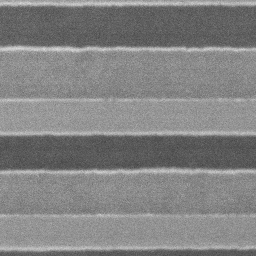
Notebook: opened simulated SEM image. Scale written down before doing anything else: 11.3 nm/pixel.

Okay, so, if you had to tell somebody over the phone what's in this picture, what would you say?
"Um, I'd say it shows lines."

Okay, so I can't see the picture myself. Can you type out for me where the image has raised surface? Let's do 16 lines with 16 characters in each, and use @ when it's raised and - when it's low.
----------------
----------------
----------------
@@@@@@@@@@@@@@@@
@@@@@@@@@@@@@@@@
@@@@@@@@@@@@@@@@
@@@@@@@@@@@@@@@@
@@@@@@@@@@@@@@@@
----------------
----------------
----------------
@@@@@@@@@@@@@@@@
@@@@@@@@@@@@@@@@
@@@@@@@@@@@@@@@@
@@@@@@@@@@@@@@@@
@@@-@@@--@----@@